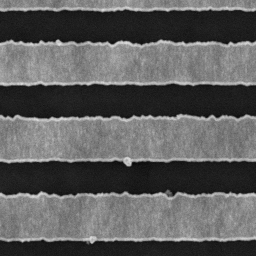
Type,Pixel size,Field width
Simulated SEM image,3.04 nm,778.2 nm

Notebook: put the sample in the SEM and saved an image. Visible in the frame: lines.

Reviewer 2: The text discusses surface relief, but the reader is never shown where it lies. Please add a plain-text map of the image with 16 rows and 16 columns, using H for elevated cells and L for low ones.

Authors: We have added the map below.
HHHHHHHHHHHHHHHH
LLLLLLLLLLLLLLLL
LLLLLLLLLLLLLLLL
HHHHHHHHHHHHHHHH
HHHHHHHHHHHHHHHH
LLLLLLLLLLLLLLLL
LLLLLLLLLLLLLLLL
HHHHHHHHHHHHHHHH
HHHHHHHHHHHHHHHH
HHHHHHHHHHHHHHHH
LLLLLLLLLLLLLLLL
LLLLLLLLLLLLLLLL
HHHHHHHHHHHHHHHH
HHHHHHHHHHHHHHHH
HHHHHHHHHHHHHHHH
LLLLLLLLLLLLLLLL